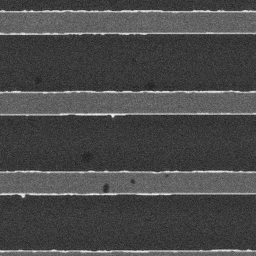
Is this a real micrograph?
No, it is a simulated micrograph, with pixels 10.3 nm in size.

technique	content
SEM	lines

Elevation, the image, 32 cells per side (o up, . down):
................................
oooooooooooooooooooooooooooooooo
oooooooooooooooooooooooooooooooo
oooooooooooooooooooooooooooooooo
................................
................................
................................
................................
................................
................................
................................
.oo.....oooo.ooooooooooooooooo.o
oooooooooooooooooooooooooooooooo
oooooooooooooooooooooooooooooooo
................................
................................
................................
................................
................................
................................
................................
.oooo......o.o.o....ooo.ooooo.o.
oooooooooooooooooooooooooooooooo
oooooooooooooooooooooooooooooooo
................................
................................
................................
................................
................................
................................
................................
oooooooooooooooooooooooooooooooo